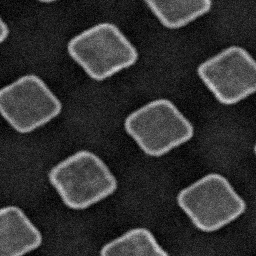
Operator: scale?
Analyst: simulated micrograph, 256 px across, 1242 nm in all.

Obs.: raised bodies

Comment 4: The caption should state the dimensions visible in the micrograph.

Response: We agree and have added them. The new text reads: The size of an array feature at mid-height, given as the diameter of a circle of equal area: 265 nm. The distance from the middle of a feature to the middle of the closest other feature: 92 pixels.